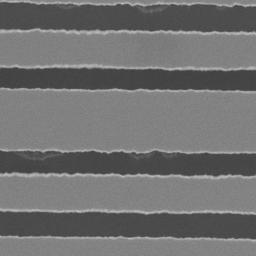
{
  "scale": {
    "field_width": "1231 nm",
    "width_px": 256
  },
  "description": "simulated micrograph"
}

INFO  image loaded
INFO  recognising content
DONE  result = lines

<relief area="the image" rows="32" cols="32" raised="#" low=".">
.........#.####.####.###..######
................................
................................
................................
################################
################################
################################
################################
...###...#.#####################
................................
................................
################################
################################
################################
################################
################################
################################
################################
################################
................................
................................
................................
################################
################################
################################
################################
...#..#####.####################
................................
................................
................................
################################
################################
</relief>